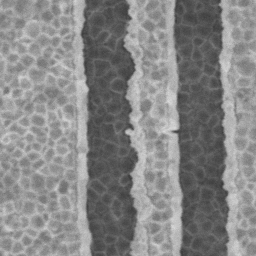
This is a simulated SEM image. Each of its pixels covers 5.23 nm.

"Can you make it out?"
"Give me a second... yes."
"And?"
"one or a few lines or trenches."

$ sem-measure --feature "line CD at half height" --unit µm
0.195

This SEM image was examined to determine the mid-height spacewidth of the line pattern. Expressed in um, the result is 0.282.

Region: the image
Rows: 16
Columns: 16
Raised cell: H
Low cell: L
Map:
HHHHHLLLHHHLLLHH
HHHHHLLLHHHLLLHH
HHHHHLLLHHHLLLHH
HHHHHLLLHHHLLLHH
HHHHHLLLHHHLLLHH
HHHHHLLLHHHLLLHH
HHHHHLLLHHHLLLHH
HHHHHLLLHHHLLLHH
HHHHHLLLLHHLLLHH
HHHHHLLLLHHLLLHH
HHHHHLLLLHHLLLHH
HHHHHLLLHHHLLLHH
HHHHHLLLLHHLLLHH
HHHHHLLLLHHLLLHH
HHHHHLLLLHHLLLLH
HHHHHLLLLHHLLLLH